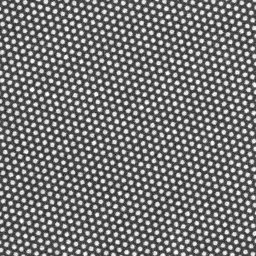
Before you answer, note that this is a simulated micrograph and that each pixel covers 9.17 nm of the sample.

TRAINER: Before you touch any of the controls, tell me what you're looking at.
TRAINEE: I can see a regular array of raised bodies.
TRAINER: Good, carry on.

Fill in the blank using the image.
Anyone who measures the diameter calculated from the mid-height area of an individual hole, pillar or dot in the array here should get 35.9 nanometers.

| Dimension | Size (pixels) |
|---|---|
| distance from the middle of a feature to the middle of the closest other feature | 7.52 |